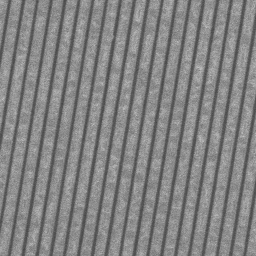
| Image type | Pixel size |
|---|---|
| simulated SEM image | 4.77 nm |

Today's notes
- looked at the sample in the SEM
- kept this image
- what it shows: parallel lines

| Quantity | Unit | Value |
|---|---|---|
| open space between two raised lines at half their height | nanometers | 20.6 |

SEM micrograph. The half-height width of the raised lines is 0.0459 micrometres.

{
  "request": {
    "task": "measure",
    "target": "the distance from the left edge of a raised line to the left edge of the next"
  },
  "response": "65.2 nm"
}